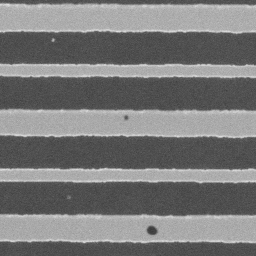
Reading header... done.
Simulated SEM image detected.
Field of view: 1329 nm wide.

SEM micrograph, lines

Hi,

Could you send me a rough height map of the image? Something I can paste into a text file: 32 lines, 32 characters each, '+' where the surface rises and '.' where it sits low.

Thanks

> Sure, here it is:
................................
++++++++++++++++++++++++++++++++
++++++++++++++++++++++++++++++++
++++++++++++++++++++++++++++++++
................................
................................
................................
................................
++++++++++++++++++++++++++++++++
..++++.+++++++++++++++++++++++++
................................
................................
................................
................................
++++++++++++++++++++++++++++++++
++++++++++++++++++++++++++++++++
++++++++++++++++++++++++++++++++
................................
................................
................................
................................
++++++++++++++++++++++++++++++++
++++++++++++++++++++++++++++++++
................................
................................
................................
................................
++++++++++++++++++++++++++++++++
++++++++++++++++++++++++++++++++
++++++++++++++++++++++++++++++++
................................
................................